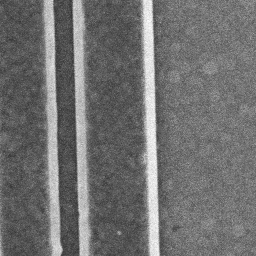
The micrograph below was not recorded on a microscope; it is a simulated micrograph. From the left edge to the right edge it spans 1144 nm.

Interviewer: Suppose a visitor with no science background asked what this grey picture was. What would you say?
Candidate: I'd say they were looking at one or a few lines or trenches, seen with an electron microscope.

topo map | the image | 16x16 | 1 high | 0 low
1110011110000000
1110011110000000
1110011110000000
1110011110000000
1110011110000000
1110011110000000
1110011110000000
1110011110000000
1110011110000000
1110011110000000
1110011111000000
1110011111000000
1110011111000000
1110011111000000
1110011111000000
1111011111000000